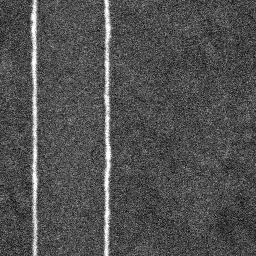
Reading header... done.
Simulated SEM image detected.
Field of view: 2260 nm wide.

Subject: one or a few lines or trenches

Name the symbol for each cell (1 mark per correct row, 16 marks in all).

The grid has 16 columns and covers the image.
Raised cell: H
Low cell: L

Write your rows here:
HHLLLLLHHHHHHHHH
HHLLLLLHHHHHHHHH
HHLLLLLHHHHHHHHH
HHLLLLLHHHHHHHHH
HHLLLLLHHHHHHHHH
HHLLLLLHHHHHHHHH
HHLLLLLHHHHHHHHH
HHLLLLLHHHHHHHHH
HHLLLLLHHHHHHHHH
HHLLLLLHHHHHHHHH
HHLLLLLHHHHHHHHH
HHLLLLLHHHHHHHHH
HHLLLLLHHHHHHHHH
HHLLLLLHHHHHHHHH
HHLLLLLHHHHHHHHH
HHLLLLLHHHHHHHHH